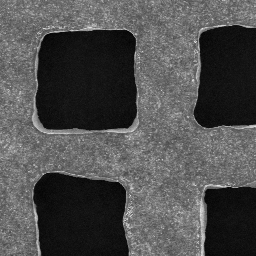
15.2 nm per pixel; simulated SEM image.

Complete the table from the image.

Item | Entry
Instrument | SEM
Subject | holes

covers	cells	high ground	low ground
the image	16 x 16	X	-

XXXXXXXXXXXXXXXX
XXXXXXXXXXXXXXXX
XXX-----XXXX----
XX------XXXX----
XX------XXXX----
XX-------XXX----
XX-------XXX----
XX-------XXX----
XXXXXXXXXXXXXXXX
XXXXXXXXXXXXXXXX
XXXXXXXXXXXXXXXX
XX-----XXXXXXXXX
XX------XXXXX---
XX------XXXXX---
XX------XXXXX---
XX------XXXXX---